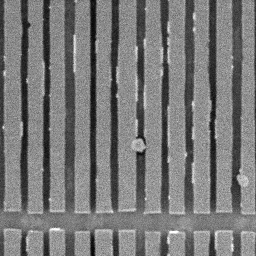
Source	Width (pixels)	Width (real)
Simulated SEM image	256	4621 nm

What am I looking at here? parallel lines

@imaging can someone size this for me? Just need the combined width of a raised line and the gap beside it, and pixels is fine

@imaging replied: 23.5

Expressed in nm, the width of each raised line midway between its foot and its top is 273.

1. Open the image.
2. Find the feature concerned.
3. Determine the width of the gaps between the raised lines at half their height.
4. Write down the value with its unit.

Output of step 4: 8.5 px